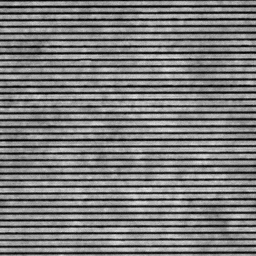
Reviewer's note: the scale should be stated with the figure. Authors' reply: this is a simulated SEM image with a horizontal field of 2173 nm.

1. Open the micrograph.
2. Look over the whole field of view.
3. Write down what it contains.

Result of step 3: parallel lines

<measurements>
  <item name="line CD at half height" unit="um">0.0329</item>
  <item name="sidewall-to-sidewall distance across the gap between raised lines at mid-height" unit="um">0.0244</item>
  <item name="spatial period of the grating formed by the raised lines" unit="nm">56.6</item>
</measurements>